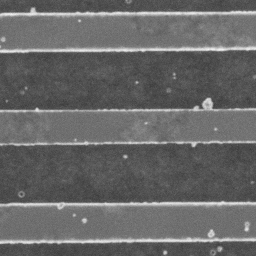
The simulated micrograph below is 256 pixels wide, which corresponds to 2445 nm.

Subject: lines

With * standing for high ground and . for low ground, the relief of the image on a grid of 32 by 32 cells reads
................................
................................
********************************
********************************
********************************
********************************
................................
................................
................................
................................
................................
................................
................................
.........................**.....
********************************
********************************
********************************
********************************
................................
................................
................................
................................
................................
................................
................................
...*****************************
********************************
********************************
********************************
********************************
................................
................................